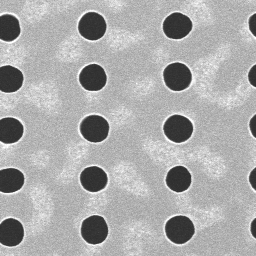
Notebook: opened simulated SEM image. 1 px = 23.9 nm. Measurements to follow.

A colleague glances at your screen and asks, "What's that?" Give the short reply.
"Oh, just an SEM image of a regular array of holes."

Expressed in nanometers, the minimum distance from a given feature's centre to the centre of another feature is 1210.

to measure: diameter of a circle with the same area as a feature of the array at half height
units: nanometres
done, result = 685